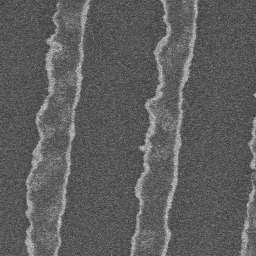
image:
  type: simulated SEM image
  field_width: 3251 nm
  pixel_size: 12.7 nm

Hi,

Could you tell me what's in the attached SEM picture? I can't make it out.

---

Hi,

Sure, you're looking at one or a few lines or trenches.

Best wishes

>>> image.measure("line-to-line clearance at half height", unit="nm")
959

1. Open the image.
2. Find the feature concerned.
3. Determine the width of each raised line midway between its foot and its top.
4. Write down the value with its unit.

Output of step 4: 396 nm